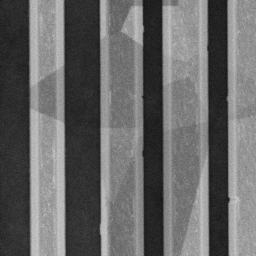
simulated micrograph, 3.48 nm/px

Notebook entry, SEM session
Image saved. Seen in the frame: one or a few lines or trenches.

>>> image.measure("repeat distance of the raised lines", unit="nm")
241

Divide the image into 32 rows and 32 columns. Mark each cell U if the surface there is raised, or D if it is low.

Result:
DDDDUUUDDDDDDUUUUDDDDUUUUDDDDUUU
DDDDUUUDDDDDDUUUUDDDDUUUUDDDDUUU
DDDDUUUDDDDDDUUUUDDDDUUUUDDDDUUU
DDDDUUUDDDDDDUUUUDDDDUUUUDDDDUUU
DDDDUUUDDDDDDUUUUDDDDUUUUDDDDUUU
DDDDUUUDDDDDDUUUUDDDDUUUUDDDDUUU
DDDDUUUDDDDDDUUUUDDDDUUUUDDDDUUU
DDDDUUUDDDDDDUUUUDDDDUUUUDDDDUUU
DDDDUUUDDDDDDUUUUDDDDUUUUDDDDUUU
DDDDUUUDDDDDDUUUUDDDDUUUUDDDDUUU
DDDDUUUDDDDDDUUUUDDDDUUUUDDDDUUU
DDDDUUUDDDDDDUUUUDDDDUUUUDDDDUUU
DDDDUUUDDDDDDUUUUDDDDUUUUDDDDUUU
DDDDUUUDDDDDDUUUUDDDDUUUUDDDDUUU
DDDDUUUDDDDDDUUUUDDDDUUUUDDDDUUU
DDDDUUUDDDDDDUUUUDDDDUUUUDDDDUUU
DDDDUUUUDDDDDUUUUDDDDUUUUDDDDUUU
DDDDUUUUDDDDDUUUUDDDDUUUUDDDDUUU
DDDDUUUDDDDDDUUUUDDDDUUUUDDDDUUU
DDDDUUUDDDDDDUUUUDDDDUUUUDDDDUUU
DDDDUUUDDDDDDUUUUDDDDUUUUDDDDUUU
DDDDUUUDDDDDDUUUUDDDDUUUUDDDDUUU
DDDDUUUDDDDDDUUUUDDDDUUUUDDDDUUU
DDDDUUUDDDDDDUUUUDDDDUUUUDDDDUUU
DDDDUUUDDDDDDUUUUDDDDUUUUDDDDUUU
DDDDUUUDDDDDDUUUUDDDDUUUUDDDDUUU
DDDDUUUDDDDDDUUUUDDDDUUUUDDDDUUU
DDDDUUUDDDDDDUUUUDDDDUUUUDDDDUUU
DDDDUUUDDDDDDUUUUDDDDUUUUDDDDUUU
DDDDUUUDDDDDDUUUUDDDDUUUUDDDDUUU
DDDDDUUDDDDDDUUUUDDDDUUUUDDDDUUU
DDDDDUUUDDDDDUUUUDDDDUUUUDDDDUUU